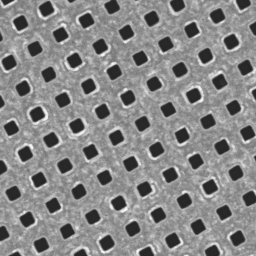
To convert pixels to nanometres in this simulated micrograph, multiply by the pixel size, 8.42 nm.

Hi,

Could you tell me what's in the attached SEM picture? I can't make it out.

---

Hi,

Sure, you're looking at a regular array of holes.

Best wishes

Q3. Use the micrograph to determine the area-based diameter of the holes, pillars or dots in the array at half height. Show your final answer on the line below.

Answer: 14.2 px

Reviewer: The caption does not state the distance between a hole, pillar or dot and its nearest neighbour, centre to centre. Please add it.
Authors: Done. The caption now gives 244 nm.